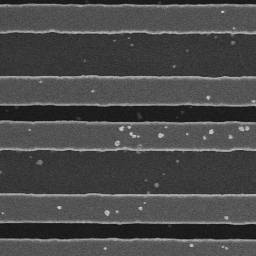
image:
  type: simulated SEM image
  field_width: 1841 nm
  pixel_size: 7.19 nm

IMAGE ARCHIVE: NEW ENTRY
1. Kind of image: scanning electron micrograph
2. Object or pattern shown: lines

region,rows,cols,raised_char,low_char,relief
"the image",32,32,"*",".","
...**...........................
********************************
********************************
********************************
................................
................................
................................
................................
................................
..........***...................
********************************
********************************
********************************
................................
................................
********************************
********************************
********************************
********************************
................................
................................
................................
................................
................................
********************************
********************************
********************************
********************************
................................
................................
********************************
********************************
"